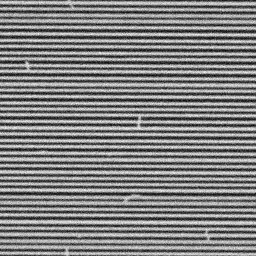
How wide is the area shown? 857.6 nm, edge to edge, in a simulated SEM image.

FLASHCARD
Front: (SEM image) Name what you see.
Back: parallel lines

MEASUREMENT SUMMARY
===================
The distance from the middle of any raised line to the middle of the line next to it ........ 21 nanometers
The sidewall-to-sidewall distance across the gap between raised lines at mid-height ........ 9.6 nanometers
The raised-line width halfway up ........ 0.0096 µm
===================